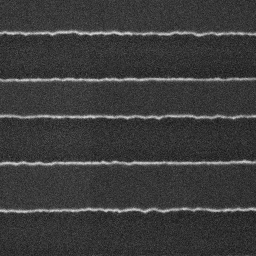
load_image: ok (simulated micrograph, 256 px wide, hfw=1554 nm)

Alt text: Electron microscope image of lines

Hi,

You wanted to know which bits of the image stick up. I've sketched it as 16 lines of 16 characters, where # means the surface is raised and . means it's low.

################
################
................
................
................
################
################
................
................
................
################
################
################
................
................
................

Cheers